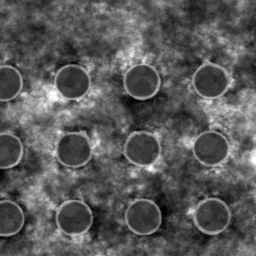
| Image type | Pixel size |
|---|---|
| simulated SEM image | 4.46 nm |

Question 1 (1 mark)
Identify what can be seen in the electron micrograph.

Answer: a regular array of raised bodies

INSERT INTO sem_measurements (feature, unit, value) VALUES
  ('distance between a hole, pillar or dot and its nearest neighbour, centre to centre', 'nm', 301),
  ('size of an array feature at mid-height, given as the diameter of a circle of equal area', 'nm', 159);